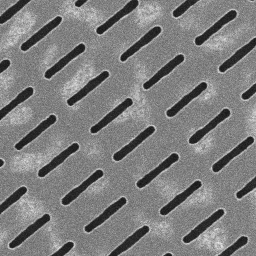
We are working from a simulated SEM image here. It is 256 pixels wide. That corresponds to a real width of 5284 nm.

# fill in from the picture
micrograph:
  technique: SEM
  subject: a regular array of holes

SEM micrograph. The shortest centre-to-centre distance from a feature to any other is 739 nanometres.